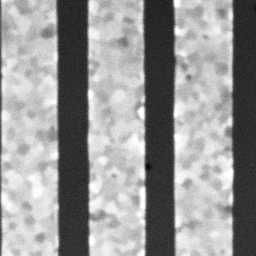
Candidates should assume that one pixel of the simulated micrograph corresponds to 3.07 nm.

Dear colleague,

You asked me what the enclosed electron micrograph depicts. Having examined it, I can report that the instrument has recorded wiring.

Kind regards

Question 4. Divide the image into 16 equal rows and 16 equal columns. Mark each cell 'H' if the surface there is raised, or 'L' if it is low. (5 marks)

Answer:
HHHLLLHHHLLHHHLL
HHHLLLHHHLLHHHLL
HHHHLLHHHLLHHHLL
HHHHLLHHHLLHHHLL
HHHLLLHHHLLHHHLL
HHHHLLHHHLLHHHLL
HHHLLLHHHLLHHHLL
HHHLLLHHHLLHHHLL
HHHHLLHHHLLHHHLL
HHHHLLHHHLLHHHLL
HHHHLLHHHLLHHHLL
HHHHLLHHHLLHHHLL
HHHHLLHHHLLHHHLL
HHHHLLHHHLLHHHLL
HHHHLLHHHLLHHHLL
HHHHLLHHHLLHHHLL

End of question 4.